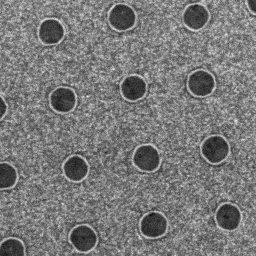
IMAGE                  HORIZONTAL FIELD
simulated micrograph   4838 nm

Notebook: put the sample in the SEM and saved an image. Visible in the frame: a regular array of raised bodies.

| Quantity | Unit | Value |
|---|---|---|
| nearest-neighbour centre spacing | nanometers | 1290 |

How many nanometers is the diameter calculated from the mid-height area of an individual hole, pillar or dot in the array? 520